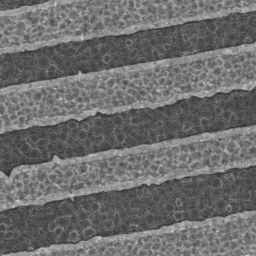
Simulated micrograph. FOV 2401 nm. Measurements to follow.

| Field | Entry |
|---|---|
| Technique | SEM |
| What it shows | one or a few lines or trenches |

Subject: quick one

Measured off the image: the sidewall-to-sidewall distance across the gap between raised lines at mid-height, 397 nanometres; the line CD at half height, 348 nm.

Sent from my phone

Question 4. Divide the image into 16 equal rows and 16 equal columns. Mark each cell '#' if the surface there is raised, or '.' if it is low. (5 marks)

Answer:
..##############
##########......
####............
.............###
.......#########
.#############..
##########......
####............
.............###
.......#########
..############..
########........
###.............
...............#
..........######
...#############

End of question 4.